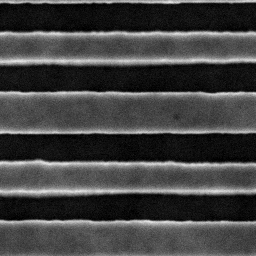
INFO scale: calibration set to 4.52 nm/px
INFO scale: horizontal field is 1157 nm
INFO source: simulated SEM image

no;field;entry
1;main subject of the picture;lines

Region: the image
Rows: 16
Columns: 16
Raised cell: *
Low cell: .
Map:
................
................
****************
****************
................
................
****************
****************
................
................
****************
****************
................
................
****************
****************